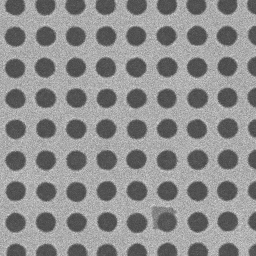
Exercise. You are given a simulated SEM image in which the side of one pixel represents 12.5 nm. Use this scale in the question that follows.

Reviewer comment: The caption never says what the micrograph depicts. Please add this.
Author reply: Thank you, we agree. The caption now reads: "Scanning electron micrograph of a regular array of holes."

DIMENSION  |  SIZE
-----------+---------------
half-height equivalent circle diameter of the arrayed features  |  20.8 pixels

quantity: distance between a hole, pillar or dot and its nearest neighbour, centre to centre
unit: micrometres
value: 0.376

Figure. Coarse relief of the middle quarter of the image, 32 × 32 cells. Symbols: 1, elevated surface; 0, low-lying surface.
00000011000001100000011000000110
00000011000001100000011000001110
10000111000001110000111100001110
11111111111111111101111111111111
11111111111111111111111111111111
11111111111111111111111111111111
10000111100011111000111100011111
10000011000001110000111100001110
00000011000001100000011000001110
10000011000001110000011000001110
10000111100011110000111100011110
11111111111111111111111111111111
11111111111111111111111111111111
11111111111111111111111111111111
10000111100011110000111100001110
00000011000001110000011000001110
10000011000001110000011000001110
10000111000001110000011100001110
11001111100011111000111100011111
11111111111111111111111111111111
11111111111111111111111111111111
11111111110111111001111110111111
10000111100001110000111100001110
10000011000001100000011000001110
00000011000001100000011000001110
10000111000001110000111100001110
11001111111111111111111110011111
11111111111111111111111111111111
11111111111111111111111111111111
11111111110011111000111110011111
10000111000001110000011100001110
10000011000001100000011000000110